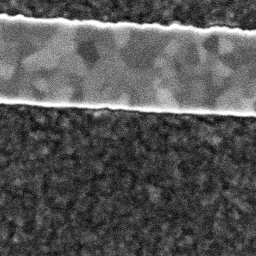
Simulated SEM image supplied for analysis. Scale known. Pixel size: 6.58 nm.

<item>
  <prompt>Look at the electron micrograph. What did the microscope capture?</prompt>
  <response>one or a few lines or trenches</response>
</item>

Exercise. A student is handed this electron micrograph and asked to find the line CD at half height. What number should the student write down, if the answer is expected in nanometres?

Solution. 561